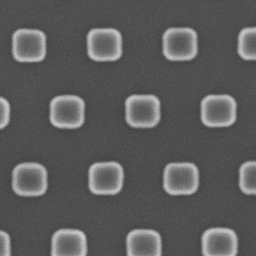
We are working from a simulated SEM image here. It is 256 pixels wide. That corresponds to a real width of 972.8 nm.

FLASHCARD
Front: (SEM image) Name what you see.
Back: a regular array of raised bodies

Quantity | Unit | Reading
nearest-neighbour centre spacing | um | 0.286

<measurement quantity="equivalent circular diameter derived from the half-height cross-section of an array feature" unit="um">0.127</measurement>